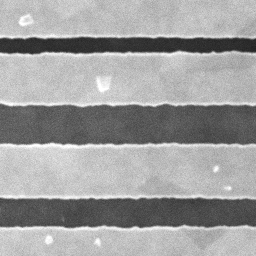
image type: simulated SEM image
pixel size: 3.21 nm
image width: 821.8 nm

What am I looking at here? lines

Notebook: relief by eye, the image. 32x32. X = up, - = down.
XXXXXXXXXXXXXXXXXXXXXXXXXXXXXXXX
XXXXXXXXXXXXXXXXXXXXXXXXXXXXXXXX
XXXXXXXXXXXXXXXXXXXXXXXXXXXXXXXX
XXXXXXXXXXXXXXXXXXXXXXXXXXXXXXXX
XXXXXXXXXXXXXXXXXXXXXXXXXXXXXXXX
--------------------------------
----------------X-----XX----XX--
XXXXXXXXXXXXXXXXXXXXXXXXXXXXXXXX
XXXXXXXXXXXXXXXXXXXXXXXXXXXXXXXX
XXXXXXXXXXXXXXXXXXXXXXXXXXXXXXXX
XXXXXXXXXXXXXXXXXXXXXXXXXXXXXXXX
XXXXXXXXXXXXXXXXXXXXXXXXXXXXXXXX
XXXXXXXXXXXXXXXXXXXXXXXXXXXXXXXX
--------------------------------
--------------------------------
--------------------------------
--------------------------------
--------------------------------
XXXXXXXXXXXXXXXXXXXXXXXXXXXXXXXX
XXXXXXXXXXXXXXXXXXXXXXXXXXXXXXXX
XXXXXXXXXXXXXXXXXXXXXXXXXXXXXXXX
XXXXXXXXXXXXXXXXXXXXXXXXXXXXXXXX
XXXXXXXXXXXXXXXXXXXXXXXXXXXXXXXX
XXXXXXXXXXXXXXXXXXXXXXXXXXXXXXXX
XXXXXXXXXXXXXXXXXXXXXXXXXXXXXXXX
--------------------------------
--------------------------------
--------------------------------
XXXXXXXXXXXXXXXXXXXXXXXXXXXXXXXX
XXXXXXXXXXXXXXXXXXXXXXXXXXXXXXXX
XXXXXXXXXXXXXXXXXXXXXXXXXXXXXXXX
XXXXXXXXXXXXXXXXXXXXXXXXXXXXXXXX